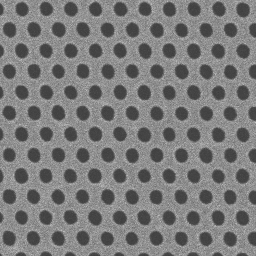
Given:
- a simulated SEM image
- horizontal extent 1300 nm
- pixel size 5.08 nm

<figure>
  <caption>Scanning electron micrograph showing a regular array of holes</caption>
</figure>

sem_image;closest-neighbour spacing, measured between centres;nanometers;121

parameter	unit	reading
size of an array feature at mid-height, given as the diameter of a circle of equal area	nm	70.9